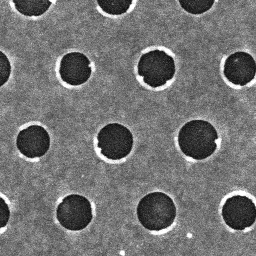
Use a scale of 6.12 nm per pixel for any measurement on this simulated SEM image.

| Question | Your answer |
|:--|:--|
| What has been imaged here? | holes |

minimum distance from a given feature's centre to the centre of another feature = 0.499 µm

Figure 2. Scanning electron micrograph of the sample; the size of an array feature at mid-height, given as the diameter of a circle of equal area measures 224 nm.